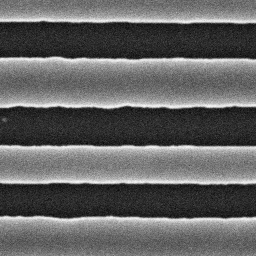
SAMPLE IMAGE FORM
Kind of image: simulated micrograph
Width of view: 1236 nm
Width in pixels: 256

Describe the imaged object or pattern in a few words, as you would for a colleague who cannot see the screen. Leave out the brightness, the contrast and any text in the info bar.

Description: lines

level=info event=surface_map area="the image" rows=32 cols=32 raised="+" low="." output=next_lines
++++++++++++++++++++++++++++++++
++++++++++++++++++++++++++++++++
++++++++++++++++++++++++++++++++
................................
................................
................................
................................
++++++++++++++++.+++++++++++++++
++++++++++++++++++++++++++++++++
++++++++++++++++++++++++++++++++
++++++++++++++++++++++++++++++++
++++++++++++++++++++++++++++++++
++++++++++++++++++++++++++++++++
.............+.......+..........
................................
................................
................................
................................
++++++++++++++++++++++++++++++++
++++++++++++++++++++++++++++++++
++++++++++++++++++++++++++++++++
++++++++++++++++++++++++++++++++
++++++++++++++++++++++++++++++++
................................
................................
................................
................................
++++++++++++++++++++++++++++++++
++++++++++++++++++++++++++++++++
++++++++++++++++++++++++++++++++
++++++++++++++++++++++++++++++++
++++++++++++++++++++++++++++++++